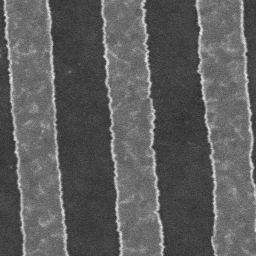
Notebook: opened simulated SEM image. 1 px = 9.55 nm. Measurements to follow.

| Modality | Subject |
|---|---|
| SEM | one or a few lines or trenches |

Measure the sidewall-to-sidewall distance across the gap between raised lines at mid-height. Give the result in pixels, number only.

54.7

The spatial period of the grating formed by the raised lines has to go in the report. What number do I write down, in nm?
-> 920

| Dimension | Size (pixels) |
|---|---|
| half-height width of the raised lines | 41.3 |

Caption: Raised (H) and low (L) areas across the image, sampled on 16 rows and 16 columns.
HHHLLLHHHLLLHHHL
HHHLLLHHHLLLHHHL
HHHLLLLHHLLLHHHL
LHHLLLLHHLLLHHHL
LHHLLLLHHLLLLHHL
LHHLLLLHHLLLLHHL
LHHLLLLHHLLLLHHH
LHHLLLLHHHLLLHHH
LHHLLLLHHHLLLHHH
LHHHLLLHHHLLLHHH
LHHHLLLHHHLLLHHH
LHHHLLLHHHLLLHHH
LHHHLLLHHHLLLHHH
LHHHLLLHHHLLLHHH
LHHHLLLHHHLLLHHH
LHHHLLLLHHLLLHHH